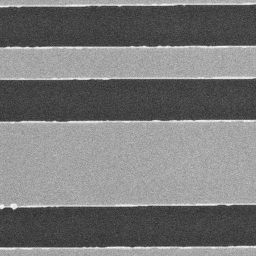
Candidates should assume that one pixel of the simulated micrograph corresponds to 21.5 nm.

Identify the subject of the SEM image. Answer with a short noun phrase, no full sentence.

lines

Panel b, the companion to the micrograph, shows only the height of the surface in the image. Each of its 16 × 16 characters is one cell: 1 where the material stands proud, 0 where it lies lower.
0000000000000000
0000000000000000
0000000000000000
1111111111111111
1111111111111111
0000000000000000
0000000000000000
0000000000000000
1111111111111111
1111111111111111
1111111111111111
1111111111111111
1111111111111111
0000000000000000
0000000000000000
0000011111111111